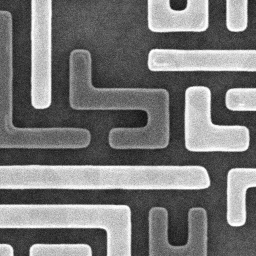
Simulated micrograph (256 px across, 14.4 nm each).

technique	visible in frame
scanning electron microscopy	wiring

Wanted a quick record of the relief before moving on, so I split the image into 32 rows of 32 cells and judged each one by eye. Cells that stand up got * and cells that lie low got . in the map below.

....**.............**..***..***.
*...**.............*******..***.
*...**.............*******..***.
*...**.............*******...**.
*...**..........................
*...**..........................
*...**...**........*************
*...**...**........*************
**..**...**........*************
**..**...**.....................
*...**...**.....................
*...**...************..***...***
*...**...************..***..****
*........************..***...***
*.................***..***......
**................***..****.....
***********...*******..********.
***********...*******..********.
..............******...********.
................................
................................
**************************...***
**************************...***
**************************..***.
............................***.
............................***.
****************...**...**..***.
****************...**...**..***.
.............***...**...**......
.............***...**...**......
..............**...**..***......
**..*******...**...*******......